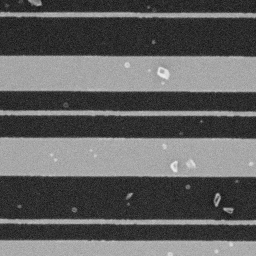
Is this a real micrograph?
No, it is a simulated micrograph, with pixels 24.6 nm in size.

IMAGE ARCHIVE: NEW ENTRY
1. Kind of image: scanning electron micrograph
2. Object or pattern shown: lines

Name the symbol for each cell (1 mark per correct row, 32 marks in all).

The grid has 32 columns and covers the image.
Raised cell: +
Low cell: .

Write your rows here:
....+...........................
................................
................................
................................
................................
................................
................................
++++++++++++++++++++++++++++++++
++++++++++++++++++++++++++++++++
++++++++++++++++++++++++++++++++
++++++++++++++++++++++++++++++++
................................
................................
................................
................................
................................
................................
++++++++++++++++++++++++++++++++
++++++++++++++++++++++++++++++++
++++++++++++++++++++++++++++++++
++++++++++++++++++++++++++++++++
++++++++++++++++++++++++++++++++
................................
................................
................................
................................
................................
................................
................................
................................
++++++++++++++++++++++++++++++++
++++++++++++++++++++++++++++++++